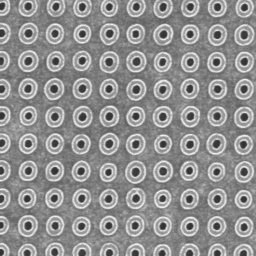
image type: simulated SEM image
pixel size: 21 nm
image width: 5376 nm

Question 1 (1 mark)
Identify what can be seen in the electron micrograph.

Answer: a regular array of ring-shaped raised bodies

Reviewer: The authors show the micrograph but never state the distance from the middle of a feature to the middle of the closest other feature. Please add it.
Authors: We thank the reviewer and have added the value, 0.557 um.